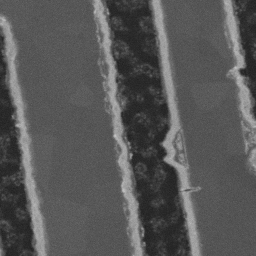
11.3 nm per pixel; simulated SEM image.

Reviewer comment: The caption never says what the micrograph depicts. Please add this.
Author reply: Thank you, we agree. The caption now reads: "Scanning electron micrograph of one or a few lines or trenches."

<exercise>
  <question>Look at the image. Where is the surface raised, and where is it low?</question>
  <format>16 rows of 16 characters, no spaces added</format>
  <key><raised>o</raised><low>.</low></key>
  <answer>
oooooo....oooo..
ooooooo...ooooo.
.oooooo...ooooo.
.oooooo...ooooo.
.oooooo...ooooo.
.oooooo....oooo.
.oooooo....oooo.
.oooooo....ooooo
.oooooo....ooooo
..oooooo...ooooo
..oooooo...ooooo
..oooooo....oooo
..oooooo....oooo
..oooooo....oooo
..oooooo....oooo
...oooooo...oooo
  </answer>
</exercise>